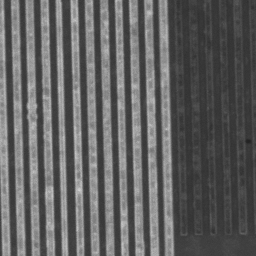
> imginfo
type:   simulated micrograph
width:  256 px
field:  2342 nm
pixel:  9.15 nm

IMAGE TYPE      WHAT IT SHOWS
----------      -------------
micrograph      parallel lines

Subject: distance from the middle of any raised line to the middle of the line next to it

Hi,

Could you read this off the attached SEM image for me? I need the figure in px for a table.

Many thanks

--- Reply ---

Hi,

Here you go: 14.8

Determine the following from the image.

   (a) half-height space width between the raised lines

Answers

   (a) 78.9 nm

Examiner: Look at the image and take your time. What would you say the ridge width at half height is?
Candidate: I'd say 52.6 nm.